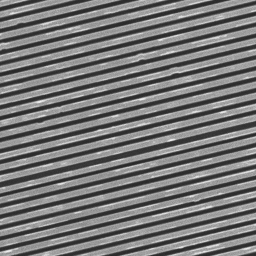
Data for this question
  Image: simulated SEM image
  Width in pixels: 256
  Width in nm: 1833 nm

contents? parallel lines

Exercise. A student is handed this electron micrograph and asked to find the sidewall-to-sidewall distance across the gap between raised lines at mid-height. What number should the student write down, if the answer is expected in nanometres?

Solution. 30.5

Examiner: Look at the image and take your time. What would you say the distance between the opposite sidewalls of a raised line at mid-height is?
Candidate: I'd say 0.0427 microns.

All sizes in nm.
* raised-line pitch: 76.1